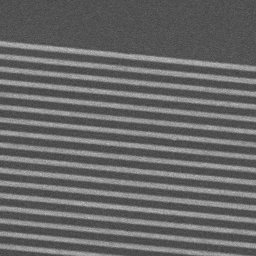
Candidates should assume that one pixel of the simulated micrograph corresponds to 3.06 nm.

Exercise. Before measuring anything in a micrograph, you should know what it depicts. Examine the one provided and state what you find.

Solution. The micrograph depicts parallel lines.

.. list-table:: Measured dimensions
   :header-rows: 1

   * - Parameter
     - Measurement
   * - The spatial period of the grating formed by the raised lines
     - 38.5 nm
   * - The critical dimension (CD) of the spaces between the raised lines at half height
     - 7.58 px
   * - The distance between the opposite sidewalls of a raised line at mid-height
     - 15.6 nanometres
